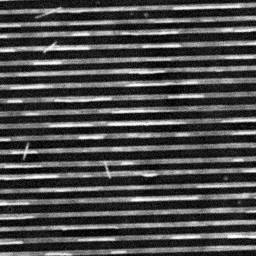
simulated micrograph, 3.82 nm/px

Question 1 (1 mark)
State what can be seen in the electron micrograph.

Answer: parallel lines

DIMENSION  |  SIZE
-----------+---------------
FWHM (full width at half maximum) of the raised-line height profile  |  15.8 nm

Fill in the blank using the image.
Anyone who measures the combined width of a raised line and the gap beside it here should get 48.7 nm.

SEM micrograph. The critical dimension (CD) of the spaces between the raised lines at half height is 0.032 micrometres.